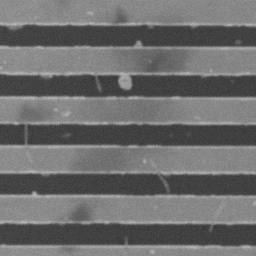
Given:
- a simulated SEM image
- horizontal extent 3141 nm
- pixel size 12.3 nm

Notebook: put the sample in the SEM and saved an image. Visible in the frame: lines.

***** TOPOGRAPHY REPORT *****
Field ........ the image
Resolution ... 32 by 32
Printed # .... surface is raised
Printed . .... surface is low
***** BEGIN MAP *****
################################
################################
################################
................................
................................
................................
################################
################################
################################
...............#................
...............#................
................................
################################
################################
################################
.#######..############.#########
................................
................................
################################
################################
################################
################################
................................
................................
################...###.##...#...
################################
################################
################################
................................
................................
................................
################################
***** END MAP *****